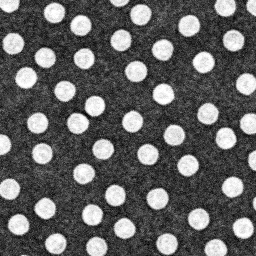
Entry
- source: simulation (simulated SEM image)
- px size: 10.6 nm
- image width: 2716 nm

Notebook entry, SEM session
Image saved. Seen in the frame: a regular array of raised bodies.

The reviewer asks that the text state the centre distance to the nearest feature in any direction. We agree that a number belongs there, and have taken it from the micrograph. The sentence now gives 347 nanometers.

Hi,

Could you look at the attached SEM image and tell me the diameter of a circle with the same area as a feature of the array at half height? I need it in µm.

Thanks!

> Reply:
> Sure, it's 0.21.